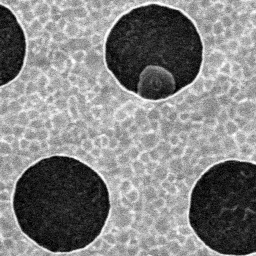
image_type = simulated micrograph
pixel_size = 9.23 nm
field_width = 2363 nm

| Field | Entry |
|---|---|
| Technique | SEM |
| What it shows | holes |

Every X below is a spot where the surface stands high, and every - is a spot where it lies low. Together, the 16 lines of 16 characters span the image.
XXXXXXXX---XXXXX
-XXXXXX-----XXXX
--XXXXX------XXX
--XXXXX------XXX
-XXXXXX-----XXXX
XXXXXXXX---XXXXX
XXXXXXXXXXXXXXXX
XXXXXXXXXXXXXXXX
XXXXXXXXXXXXXXXX
XXXXXXXXXXXXXXXX
XX----XXXXXXX---
X------XXXXX----
X------XXXXX----
X------XXXXX----
X-----XXXXXX----
XXX--XXXXXXXX---